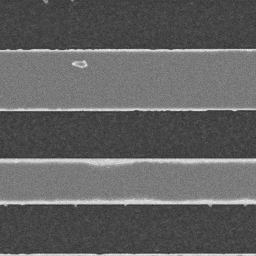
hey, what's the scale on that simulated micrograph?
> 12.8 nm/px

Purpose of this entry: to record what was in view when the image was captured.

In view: lines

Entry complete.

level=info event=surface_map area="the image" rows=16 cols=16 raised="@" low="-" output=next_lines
----------------
----------------
----------------
@@@@@@@@@@@@@@@@
@@@@@@@@@@@@@@@@
@@@@@@@@@@@@@@@@
@@@@@@@@@@@@@@@@
----------------
----------------
----------------
@@@@@@@@@@@@@@@@
@@@@@@@@@@@@@@@@
@@@@@@@@@@@@@@@@
----------------
----------------
----------------